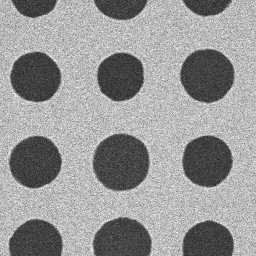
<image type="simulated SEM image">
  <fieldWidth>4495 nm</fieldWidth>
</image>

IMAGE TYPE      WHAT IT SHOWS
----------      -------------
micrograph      holes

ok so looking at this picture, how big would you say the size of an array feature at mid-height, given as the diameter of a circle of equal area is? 912 nanometres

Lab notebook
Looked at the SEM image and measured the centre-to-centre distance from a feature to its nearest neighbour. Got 1.5 micrometres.